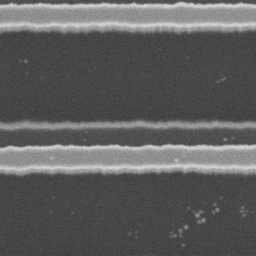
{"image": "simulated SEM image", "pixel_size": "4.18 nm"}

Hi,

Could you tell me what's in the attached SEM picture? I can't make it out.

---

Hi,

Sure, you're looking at lines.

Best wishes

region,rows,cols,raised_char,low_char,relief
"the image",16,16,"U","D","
UUUUUUUUUUUUUUUU
UUUUUUUUUUUUUUUU
DDDDDDDDDDDDDDDD
DDDDDDDDDDDDDDDD
DDDDDDDDDDDDDDDD
DDDDDDDDDDDDDDDD
DDDDDDDDDDDDDDDD
DDDDDDDDDDDDDDDD
UUUUUUUUUUUUUUUU
UUUUUUUUUUUUUUUU
UUUUUUUUUUUDUUUU
DDDDDDDDDDDDDDDD
DDDDDDDDDDDDDDDD
DDDDDDDDDDDDDDDD
DDDDDDDDDDDDDDDD
DDDDDDDDDDDDDDDD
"